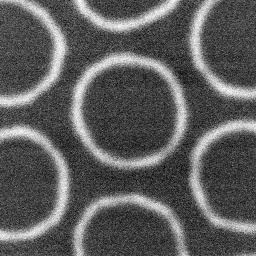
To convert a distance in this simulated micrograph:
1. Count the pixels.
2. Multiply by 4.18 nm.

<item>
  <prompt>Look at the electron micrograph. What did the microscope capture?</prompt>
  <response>raised bodies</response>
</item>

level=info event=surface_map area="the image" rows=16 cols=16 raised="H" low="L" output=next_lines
HHLLLHHHHHLLLHHH
HHHLLLHHHLLLHHHH
HHHHLLLLLLLLHHHH
HHHHLLLLLLLLHHHH
HHHLLLHHHHLLLHHH
HHHLLHHHHHHLLLHH
LLLLLHHHHHHLLLLL
LLLLLHHHHHHLLLLL
HHLLLHHHHHHLLHHH
HHHLLLHHHHLLHHHH
HHHHLLLLLLLLHHHH
HHHHLLLLLLLLHHHH
HHHHLLLHHLLLHHHH
HHHHLHHHHHHLLHHH
HHLLLHHHHHHLLLLL
LLLLLHHHHHHLLLLL